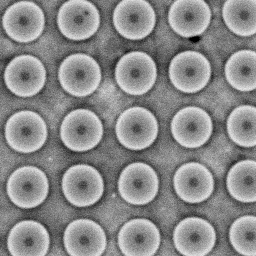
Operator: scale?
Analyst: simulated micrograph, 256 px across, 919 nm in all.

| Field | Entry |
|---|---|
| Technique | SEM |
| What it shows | an array of small figures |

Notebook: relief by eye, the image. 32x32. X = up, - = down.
--XX----XXX----XXXX---XXXX--XXXX
-XXXX--XXXXX--XXXXX--XXXXX--XXXX
XXXXX--XXXXX--XXXXX--XXXXX--XXXX
-XXXX--XXXXX---XXXX---XXXX---XXX
-XXXX---XXX----XXX-----X--------
--------------------------------
-----------------------X------XX
--XXX---XXXX---XXXX---XXXX---XXX
-XXXXX--XXXX---XXXX--XXXXX--XXXX
-XXXXX-XXXXXX-XXXXX--XXXXX--XXXX
-XXXX---XXXX---XXXX---XXXX---XXX
--XXX---XXXX----XX-----X--------
--------------------------------
-----------------X-----XX-----XX
--XXX---XXXX---XXXX---XXXX---XXX
-XXXXX--XXXXX--XXXXX-XXXXX--XXXX
-XXXXX--XXXXX--XXXXX--XXXX---XXX
-XXXXX--XXXX---XXXX---XXXX---XXX
--XXX----XX-----XX--------------
--------------------------------
-----------------X-----XX-----XX
--XXX---XXXX---XXXX---XXXX---XXX
-XXXXX--XXXXX--XXXXX--XXXXX-XXXX
-XXXXX--XXXXX--XXXXX--XXXXX-XXXX
-XXXXX--XXXXX--XXXX---XXXX---XXX
--XXX----XXX-----X--------------
--------------------------------
----------X------X-----XX-----XX
--XXXX--XXXXX--XXXXX--XXXXX--XXX
-XXXXX--XXXXX--XXXXX--XXXXX--XXX
-XXXXX--XXXXX--XXXXX--XXXXX--XXX
-XXXXX---XXXX--XXXX---XXXX----XX